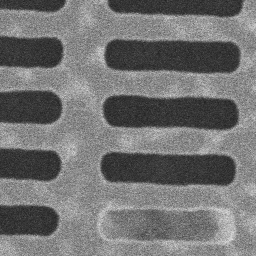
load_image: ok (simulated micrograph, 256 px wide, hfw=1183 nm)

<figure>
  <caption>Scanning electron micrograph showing holes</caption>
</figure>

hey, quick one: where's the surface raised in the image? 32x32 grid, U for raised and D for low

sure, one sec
DDDDDDDDUUUUUDDDDDDDDDDDDDDDDDUU
UUUUUDDUUUUUUUDDDDDDDDDDDDDDDDUU
UUUUUUUUUUUUUUUUUUUUUUUUUUUUUUUU
UUUUUUUUUUUUUUUUUUUUUUUUUUUUUUUU
DUUUUUUUUUUUUUUUUUUUUUUUUUUUUUUU
DDDDDDDDUUUUUDDDDDDDDDDDDDDDDUUU
DDDDDDDDUUUUUDDDDDDDDDDDDDDDDDUU
DDDDDDDDUUUUUDDDDDDDDDDDDDDDDDUU
UUUDUDDUUUUUUUDDDDDDDDDDDDDDDDUU
UUUUUUUUUUUUUUUUUUUUUUUUUUUUUUUU
UUUUUUUUUUUUUUUUUUUUUUUUUUUUUUUU
DDDDDDDUUUUUUUUUUUUUUUUUUUUUUUUU
DDDDDDDDUUUUUDDDDDDDDDDDDDDDDUUU
DDDDDDDDUUUUUDDDDDDDDDDDDDDDDDUU
DDDDDDDDUUUUUDDDDDDDDDDDDDDDDDUU
UUDUDDUUUUUUUUDDDDDDDDDDDDDDDDUU
UUUUUUUUUUUUUUUUUUUUUUUUUUUUUUUU
UUUUUUUUUUUUUUUUUUUUUUUUUUUUUUUU
UDUUUUUUUUUUUUUUUUUUUUUUUUUUUUUU
DDDDDDDUUUUUUDDDDDDDDDDDDDDDDUUU
DDDDDDDDUUUUUDDDDDDDDDDDDDDDDDUU
DDDDDDDDUUUUUDDDDDDDDDDDDDDDDDUU
UUDDDDDUUUUUUDDDDDDDDDDDDDDDDUUU
UUUUUUUUUUUUUUUUUUUUUUUUUUUUUUUU
UUUUUUUUUUUUUUUUUUUUUUUUUUUUUUUU
UUUUUUUUUUUUUUUUUUUUUUUUUUUUUUUU
DDDDDDDUUUUUUUUUUUUUUUUUUUUUUUUU
DDDDDDDUUUUUUUUUUUUUUUUUUUUUUUUU
DDDDDDDUUUUUUUUUUUUUUUUUUUUUUUUU
UUUUUDUUUUUUUUUUUUUUUUUUUUUUUUUU
UUUUUUUUUUUUUUUUUUUUUUUUUUUUUUUU
UUUUUUUUUUUUUUUUUUUUUUUUUUUUUUUU